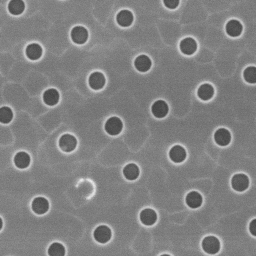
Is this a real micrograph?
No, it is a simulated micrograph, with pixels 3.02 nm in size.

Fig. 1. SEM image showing a regular array of holes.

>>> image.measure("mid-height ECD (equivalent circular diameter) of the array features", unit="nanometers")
54.7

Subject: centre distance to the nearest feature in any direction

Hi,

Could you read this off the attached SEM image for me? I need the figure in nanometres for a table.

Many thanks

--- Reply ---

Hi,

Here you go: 146